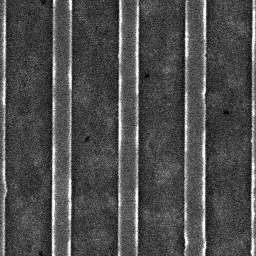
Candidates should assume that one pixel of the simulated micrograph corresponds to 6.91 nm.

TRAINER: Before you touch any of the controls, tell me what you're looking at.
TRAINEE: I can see one or a few lines or trenches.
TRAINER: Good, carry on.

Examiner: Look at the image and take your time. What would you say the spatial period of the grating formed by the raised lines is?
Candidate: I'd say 460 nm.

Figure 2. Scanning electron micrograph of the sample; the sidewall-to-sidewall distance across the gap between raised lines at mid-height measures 0.328 um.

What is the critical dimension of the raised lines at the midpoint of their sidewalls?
19.4 px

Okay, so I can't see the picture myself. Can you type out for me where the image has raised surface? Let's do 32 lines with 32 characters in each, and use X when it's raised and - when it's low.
X------XX------XXX-----XXX------
X------XX------XXX-----XXX------
X------XX------XX------XXX------
X------XX------XX------XXX------
X------XX------XX------XXX------
X------XX------XX------XXX------
X------XX------XX------XXX------
X------XX------XX------XXX------
X------XX------XX------XXX------
X------XX------XX------XXX------
X------XX------XX------XXX------
X------XX------XX------XXX------
X------XX------XX------XXX------
X------XX------XX------XXX------
X------XX------XX------XXX------
X------XX------XX------XXX------
X------XX------XX------XXX------
X------XX------XX------XXX------
X------XX------XX------XXX------
X------XX------XX------XXX------
X------XX------XX------XXX------
X-----XXX------XX------XXX------
X-----XXX------XX------XXX------
X------XX------XX------XXX------
X------XX------XX------XXX------
X------XX-----XXX------XXX-----X
X------XX------XX------XXX-----X
X--X---XX------XX----XXXXX-----X
X------XX------XX------XXX------
X------XX------XX------XXX-----X
X------XX------XX------XXX------
X---X--XX------XX------XXX-----X